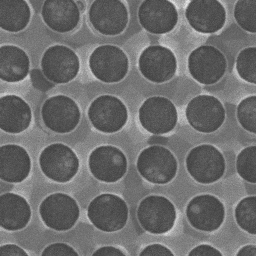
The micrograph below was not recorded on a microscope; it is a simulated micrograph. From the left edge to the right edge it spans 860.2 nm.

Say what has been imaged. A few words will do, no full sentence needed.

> a regular array of holes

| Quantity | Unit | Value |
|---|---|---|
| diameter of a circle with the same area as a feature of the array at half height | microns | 0.132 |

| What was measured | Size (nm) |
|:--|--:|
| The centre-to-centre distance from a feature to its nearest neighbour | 163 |